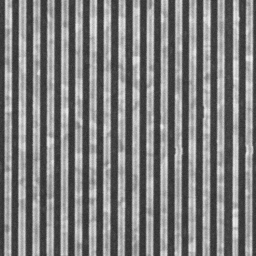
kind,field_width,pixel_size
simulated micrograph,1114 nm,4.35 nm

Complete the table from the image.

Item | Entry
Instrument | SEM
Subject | parallel lines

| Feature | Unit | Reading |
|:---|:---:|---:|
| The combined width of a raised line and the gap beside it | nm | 61.6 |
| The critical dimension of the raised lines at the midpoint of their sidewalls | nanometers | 24.5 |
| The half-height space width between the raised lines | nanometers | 37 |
